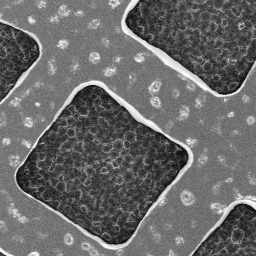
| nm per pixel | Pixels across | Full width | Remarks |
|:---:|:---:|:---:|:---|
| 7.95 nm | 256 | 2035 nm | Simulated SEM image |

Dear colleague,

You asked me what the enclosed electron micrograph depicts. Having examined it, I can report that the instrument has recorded holes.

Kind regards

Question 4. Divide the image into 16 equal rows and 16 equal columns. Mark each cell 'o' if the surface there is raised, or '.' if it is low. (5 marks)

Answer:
oooooooo........
.ooooooo........
..ooooooo.......
..oooooooo......
..oooooooooo....
.oooo.ooooooo..o
oooo....oooooooo
ooo......ooooooo
ooo.......oooooo
oo..........oooo
o...........oooo
o..........ooooo
oo........oooooo
oooo.....ooooo..
ooooo...ooooo...
oooooooooooo....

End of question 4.